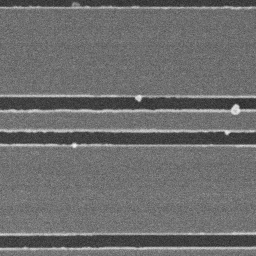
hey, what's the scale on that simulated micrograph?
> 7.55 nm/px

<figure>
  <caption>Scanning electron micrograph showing lines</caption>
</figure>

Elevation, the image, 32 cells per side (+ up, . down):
................................
++++++++++++++++++++++++++++++++
++++++++++++++++++++++++++++++++
++++++++++++++++++++++++++++++++
++++++++++++++++++++++++++++++++
++++++++++++++++++++++++++++++++
++++++++++++++++++++++++++++++++
++++++++++++++++++++++++++++++++
++++++++++++++++++++++++++++++++
++++++++++++++++++++++++++++++++
++++++++++++++++++++++++++++++++
++++++++++++++++++++++++++++++++
................................
.............................+..
++++++++++++++++++++++++++++++++
++++++++++++++++++++++++++++++++
............................+...
................................
++++++++++++++++++++++++++++++++
++++++++++++++++++++++++++++++++
++++++++++++++++++++++++++++++++
++++++++++++++++++++++++++++++++
++++++++++++++++++++++++++++++++
++++++++++++++++++++++++++++++++
++++++++++++++++++++++++++++++++
++++++++++++++++++++++++++++++++
++++++++++++++++++++++++++++++++
++++++++++++++++++++++++++++++++
++++++++++++++++++++++++++++++++
................................
................................
++++++++++++++++++++++++++++++++